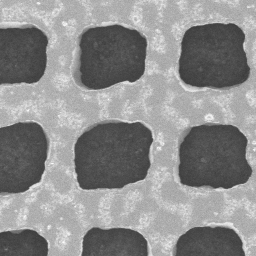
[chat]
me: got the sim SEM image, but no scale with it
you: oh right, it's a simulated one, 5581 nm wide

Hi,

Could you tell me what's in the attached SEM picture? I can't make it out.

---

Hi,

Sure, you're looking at holes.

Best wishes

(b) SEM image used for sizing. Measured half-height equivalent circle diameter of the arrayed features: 1.57 micrometres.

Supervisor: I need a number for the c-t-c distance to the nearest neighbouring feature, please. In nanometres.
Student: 2160